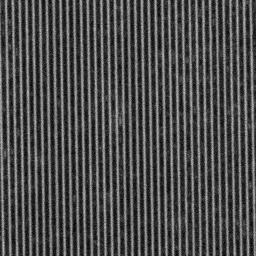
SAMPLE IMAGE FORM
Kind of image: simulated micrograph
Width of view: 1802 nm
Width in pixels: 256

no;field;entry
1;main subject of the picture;parallel lines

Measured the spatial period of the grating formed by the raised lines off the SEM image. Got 47.9 nanometers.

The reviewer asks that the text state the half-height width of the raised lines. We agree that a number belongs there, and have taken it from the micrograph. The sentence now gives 10.6 nanometers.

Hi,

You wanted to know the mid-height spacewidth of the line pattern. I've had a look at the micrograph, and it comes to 37 nanometres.